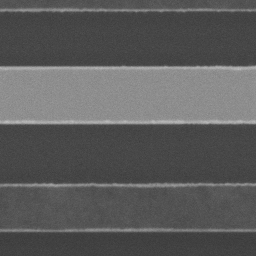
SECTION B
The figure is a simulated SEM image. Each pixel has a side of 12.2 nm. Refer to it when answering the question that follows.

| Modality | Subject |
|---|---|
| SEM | lines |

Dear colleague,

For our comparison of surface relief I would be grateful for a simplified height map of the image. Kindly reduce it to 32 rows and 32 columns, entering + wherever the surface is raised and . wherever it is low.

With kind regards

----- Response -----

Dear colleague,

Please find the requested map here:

++++++++++++++++++++++++++++++++
................................
................................
................................
................................
................................
................................
................................
++++++++++++++++++++++++++++++++
++++++++++++++++++++++++++++++++
++++++++++++++++++++++++++++++++
++++++++++++++++++++++++++++++++
++++++++++++++++++++++++++++++++
++++++++++++++++++++++++++++++++
++++++++++++++++++++++++++++++++
................................
................................
................................
................................
................................
................................
................................
................................
++++++++++++++++++++++++++++++++
++++++++++++++++++++++++++++++++
++++++++++++++++++++++++++++++++
++++++++++++++++++++++++++++++++
++++++++++++++++++++++++++++++++
++++++++++++++++++++++++++++++++
................................
................................
................................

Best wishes